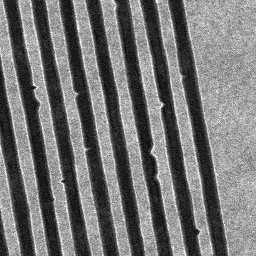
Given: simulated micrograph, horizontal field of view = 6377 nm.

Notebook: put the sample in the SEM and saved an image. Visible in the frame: parallel lines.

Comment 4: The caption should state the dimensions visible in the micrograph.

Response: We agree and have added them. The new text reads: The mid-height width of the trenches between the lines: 325 nm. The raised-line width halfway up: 346 nanometers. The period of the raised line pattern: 0.673 um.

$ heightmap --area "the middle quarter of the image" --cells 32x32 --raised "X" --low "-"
XX---XXXX---XXX----XXX----XXX---
XX---XXXX---XXX----XXX----XXX---
XX---XXXX---XXXX---XXXX---XXX---
XX---XXXX----XXX---XXXX---XXXX--
XX----XXX----XXX----XXX---XXXX--
XX----XXX----XXX----XXX----XXX--
XXX---XXXX---XXX----XXX----XXX--
XXX---XXXX---XXX----XXXX---XXX--
XXX----XXX---XXXX---XXXX---XXXX-
XXX----XXX----XXX---XXXX---XXXX-
XXX----XXX----XXX----XXXX--XXXX-
XXX----XXXX---XXX----XXX----XXX-
XXXX---XXXX---XXX----XXX----XXX-
-XXX---XXXX---XXXX---XXXX---XXXX
-XXX----XXX----XXX---XXXX---XXXX
-XXX----XXX----XXX----XXX---XXXX
-XXXX---XXX----XXX----XXX----XXX
-XXXX---XXX----XXX----XXX----XXX
--XXX---XXXX---XXXX---XXX----XXX
--XXX----XXX---XXXX---XXXX---XXX
--XXX----XXX----XXX---XXXX---XXX
--XXXX---XXX----XXX---XXXX---XXX
--XXX----XXXX---XXX---XXXX----XX
--XXXX---XXXX---XXXX---XXX----XX
---XXX---XXXX---XXXX---XXX----XX
---XXX----XXX---XXXX---XXX----XX
---XXX----XXX----XXX---XXXX---XX
---XXX----XXX----XXX---XXXX---XX
---XXXX---XXX----XXX---XXXX----X
---XXXX---XXXX---XXXX---XXX----X
---XXXX----XXX---XXXX---XXX----X
----XXX----XXX---XXXX---XXXX---X